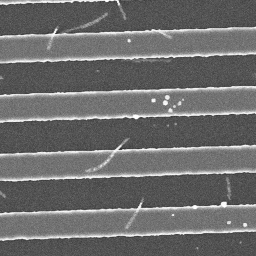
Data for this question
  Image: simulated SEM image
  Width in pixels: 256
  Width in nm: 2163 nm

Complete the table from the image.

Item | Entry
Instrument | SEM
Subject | lines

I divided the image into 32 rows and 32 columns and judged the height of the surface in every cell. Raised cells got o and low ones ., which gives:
................................
................................
................................
................................
..oooooooooooooooooooooooooooooo
oooooooooooooooooooooooooooooooo
oooooooooooooooooooooooooooooooo
ooooooooo.......................
................................
................................
................................
..............oooooooooooooooooo
oooooooooooooooooooooooooooooooo
oooooooooooooooooooooooooooooooo
oooooooooooooooooooo............
................................
................................
................................
.........................ooooooo
oooooooooooooooooooooooooooooooo
oooooooooooooooooooooooooooooooo
oooooooooooooooooooooooooooooo..
ooo.............................
................................
................................
................................
.......ooooooooooooooooooooooooo
oooooooooooooooooooooooooooooooo
oooooooooooooooooooooooooooooooo
oooooooooooooo..................
................................
................................